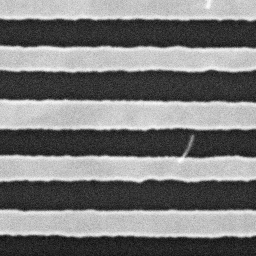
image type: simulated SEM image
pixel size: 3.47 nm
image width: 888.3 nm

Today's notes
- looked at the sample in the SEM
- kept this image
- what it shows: lines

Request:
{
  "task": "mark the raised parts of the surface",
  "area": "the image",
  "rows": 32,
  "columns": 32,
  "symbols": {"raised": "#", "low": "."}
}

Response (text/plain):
################################
################################
................................
................................
................................
................................
################################
################################
################################
................................
................................
................................
................................
################################
################################
################################
................................
................................
................................
.#..............................
################################
################################
##...#..#.......##.....##.......
................................
................................
................................
################################
################################
################################
.........##.......####.#####....
................................
................................